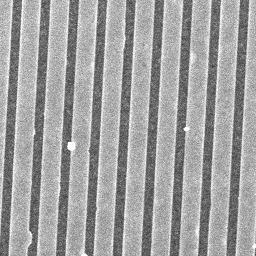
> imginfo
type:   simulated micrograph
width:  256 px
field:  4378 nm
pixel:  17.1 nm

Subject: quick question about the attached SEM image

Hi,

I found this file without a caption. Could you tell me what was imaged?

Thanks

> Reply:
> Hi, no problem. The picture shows parallel lines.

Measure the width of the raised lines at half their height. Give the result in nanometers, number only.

307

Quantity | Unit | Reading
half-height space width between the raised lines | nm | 179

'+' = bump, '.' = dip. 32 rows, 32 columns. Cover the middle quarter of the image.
...++++...+++++..+++++..+++++...
...++++...+++++..+++++..+++++..+
...++++...++++...++++...+++++..+
...++++...++++...++++...+++++..+
...++++...++++...++++...++++...+
...++++...++++...++++...++++...+
...++++...++++...++++...++++...+
...++++...++++...++++...++++...+
...++++...++++...++++...++++...+
...++++...++++...++++...++++...+
...++++...++++...++++...++++...+
...++++...++++...++++...++++...+
..+++++..+++++...++++...++++...+
..+++++..+++++...++++...++++...+
..+++++..+++++...++++...++++...+
..+++++..+++++..+++++...++++...+
..+++++..+++++..+++++...++++..++
..+++++..+++.+..+++++..+++++...+
..++++...+++....+++++..+++++...+
..++++...++++...+++++..+++++...+
.+++++...++++...++++...+++++..++
.+++++...++++...++++...+++++..++
..++++...++++...++++...+++++..++
..++++...++++...++++...++++...++
..++++...++++...++++...++++...++
..++++...++++...++++...++++...++
..++++...++++...++++...++++...++
..++++...++++...++++...++++...++
..++++...++++...++++...++++...++
..++++...++++...++++...++++...+.
..++++...++++...++++...++++...++
.+++++..+++++...++++...++++...++